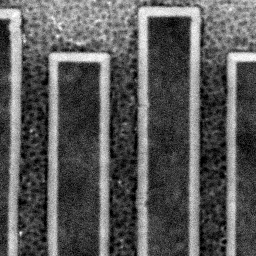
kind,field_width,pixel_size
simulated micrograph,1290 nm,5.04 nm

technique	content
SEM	one or a few lines or trenches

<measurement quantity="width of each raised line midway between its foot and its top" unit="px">51.6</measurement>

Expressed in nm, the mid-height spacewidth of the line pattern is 190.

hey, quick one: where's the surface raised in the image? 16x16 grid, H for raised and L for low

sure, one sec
LLLLLLLLLLLLLLLL
HLLLLLLLLHHHLLLL
HLLLLLLLLHHHLLLL
HLLLLLLLLHHHLLLL
HLLHHHHLLHHHLLHH
HLLHHHHLLHHHLLHH
HLLHHHHLLHHHLLHH
HLLHHHHLLHHHLLHH
HLLHHHHLLHHHLLHH
HLLHHHHLLHHHLLHH
HLLHHHHLLHHHLLHH
HLLHHHHLLHHHLLHH
HLLHHHHLLHHHLLHH
HLLHHHHLLHHHLLHH
HLLHHHLLLHHHLLHH
HLLHHHLLLHHHLLHH